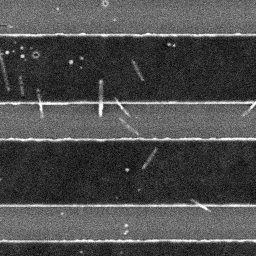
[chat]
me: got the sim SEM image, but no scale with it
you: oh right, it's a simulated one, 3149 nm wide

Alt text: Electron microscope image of lines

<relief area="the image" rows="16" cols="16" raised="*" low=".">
................
................
****************
****************
****************
****************
..*...**.......*
................
................
****************
****************
****************
****************
................
................
****************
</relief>